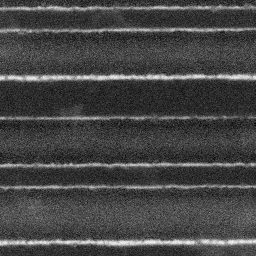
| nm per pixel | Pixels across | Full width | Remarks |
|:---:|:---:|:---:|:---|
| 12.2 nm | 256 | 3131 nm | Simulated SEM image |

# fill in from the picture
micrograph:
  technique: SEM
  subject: lines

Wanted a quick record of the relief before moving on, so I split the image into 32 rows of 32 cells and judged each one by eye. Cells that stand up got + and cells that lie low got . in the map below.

................................
++++++++++++++++++++++++++++++++
++++++++++++++++++++++++++++++++
++++++++++++++++++++++++++++++++
................................
................................
................................
................................
................................
................................
++++++++++++++++++++++++++++++++
++++++++++++++++++++++++++++++++
++++++++++++++++++++++++++++++++
++++++++++++++++++++++++++++++++
++++++++++++++++++++++++++++++++
................................
................................
................................
................................
................................
....................+.....++.++.
++++++++++++++++++++++++++++++++
++++++++++++++++++++++++++++++++
+..+....+.......................
................................
................................
................................
................................
................................
................................
++++++++++++++++++++++++++++++++
++++++++++++++++++++++++++++++++